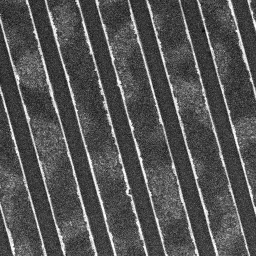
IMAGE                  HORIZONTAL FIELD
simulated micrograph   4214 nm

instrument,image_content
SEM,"parallel lines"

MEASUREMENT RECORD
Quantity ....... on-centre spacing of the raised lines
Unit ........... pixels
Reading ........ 48.9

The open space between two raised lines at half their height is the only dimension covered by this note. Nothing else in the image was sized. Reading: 0.29 um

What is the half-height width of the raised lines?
0.518 microns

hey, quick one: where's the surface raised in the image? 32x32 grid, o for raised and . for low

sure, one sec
oooo..oooo..oooo..ooooo..oooo..o
oooo..oooo..oooo...oooo..oooo..o
oooo..oooo...oooo..oooo..oooo...
oooo...oooo..oooo..oooo...oooo..
.oooo..oooo..oooo...oooo..oooo..
.oooo..oooo..ooooo..oooo..oooo..
.oooo..ooooo..oooo..oooo..ooooo.
.oooo...oooo..oooo..oooo...oooo.
..oooo..oooo..oooo...oooo..oooo.
..oooo..oooo...oooo..oooo..oooo.
..oooo...oooo..oooo..oooo...oooo
..ooooo..oooo..oooo..ooooo..oooo
...oooo..oooo...ooo...oooo..oooo
o..oooo..oooo...oooo..oooo..oooo
o..oooo...oooo..oooo..oooo...ooo
o...oooo..oooo..oooo...oooo..ooo
oo..oooo..oooo..ooooo..oooo..ooo
oo..oooo..oooo...oooo..oooo..ooo
oo..oooo...oooo..oooo..oooo...oo
oo...oooo..oooo..oooo...oooo..oo
ooo..oooo..oooo...oooo..oooo..oo
ooo..oooo..ooooo..oooo..oooo...o
ooo..ooooo..oooo..oooo..ooooo..o
ooo...oooo..oooo...ooo...oooo..o
oooo..oooo..oooo...oooo..oooo..o
oooo..oooo...oooo..oooo..oooo...
oooo...oooo..oooo..oooo...oooo..
ooooo..oooo..oooo...oooo..oooo..
.oooo..oooo..oooo...oooo..oooo..
.oooo..oooo...oooo..oooo..oooo..
.oooo...oooo..oooo..oooo...oooo.
..oooo..oooo..oooo...oooo..oooo.